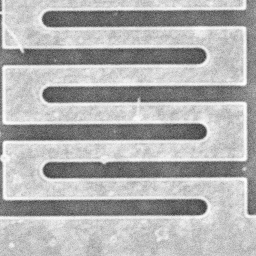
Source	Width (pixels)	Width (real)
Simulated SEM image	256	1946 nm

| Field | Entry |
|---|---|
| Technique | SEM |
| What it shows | groups of lines, slits or small figures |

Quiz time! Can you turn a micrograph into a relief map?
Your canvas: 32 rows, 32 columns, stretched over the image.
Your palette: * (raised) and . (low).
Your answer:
*******************************.
******..........................
*****...........................
.*****..........................
.******************************.
.******************************.
..........................*****.
..........................*****.
.******************************.
.******************************.
.**************************.....
.****...........................
.****...........................
.******************************.
.******************************.
.........................******.
..........................*****.
.........................******.
.******************************.
*******************************.
******..........................
.****...........................
.*****...........*************..
.******************************.
.******************************.
..........................*****.
..........................*****.
********************************
********************************
********************************
********************************
********************************